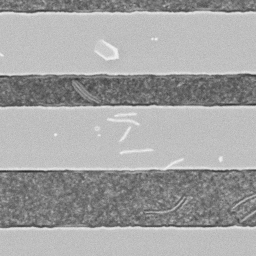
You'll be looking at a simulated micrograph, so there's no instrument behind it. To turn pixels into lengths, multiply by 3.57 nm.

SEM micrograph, lines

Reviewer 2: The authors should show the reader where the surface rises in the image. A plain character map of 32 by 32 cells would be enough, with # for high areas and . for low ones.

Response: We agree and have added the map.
................................
.................##.....###....#
################################
################################
################################
################################
################################
################################
################################
................................
................................
................................
................................
################################
################################
################################
################################
################################
################################
################################
################################
................................
................................
................................
................................
................................
................................
................................
.###############################
################################
################################
################################